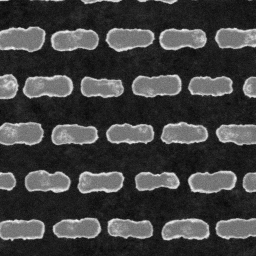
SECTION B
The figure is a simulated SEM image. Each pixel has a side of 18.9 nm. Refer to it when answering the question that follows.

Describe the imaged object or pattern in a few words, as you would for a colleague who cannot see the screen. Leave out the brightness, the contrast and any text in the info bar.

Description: a regular array of raised bodies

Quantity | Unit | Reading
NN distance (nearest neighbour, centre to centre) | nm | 1020